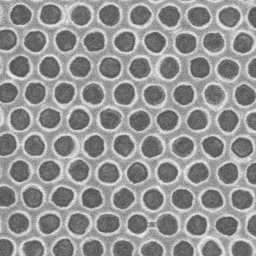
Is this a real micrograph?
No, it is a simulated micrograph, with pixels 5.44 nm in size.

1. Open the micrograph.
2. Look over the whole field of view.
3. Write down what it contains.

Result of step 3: a regular array of holes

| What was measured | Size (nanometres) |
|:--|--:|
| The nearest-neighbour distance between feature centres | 158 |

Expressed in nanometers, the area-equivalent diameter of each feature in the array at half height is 118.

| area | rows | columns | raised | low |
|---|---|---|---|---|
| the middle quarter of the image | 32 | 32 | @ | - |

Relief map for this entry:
@------@@-----@@------@@-----@@@
@------@@-----@@------@------@@@
@@----@@@-----@@@----@@@----@@@@
@@@@@@@@@@@-@@@@@@--@@@@@--@@@@@
@@@@@@@@@@@@@@@@@@@@@@@@@@@@@@@@
--@@@----@@@@----@@@@---@@@@----
---@@-----@@@-----@@-----@@@----
---@------@@------@@-----@@-----
--@@@-----@@@-----@@-----@@-----
-@@@@----@@@@----@@@@----@@@----
@@@@@@@-@@@@@@@@@@@@@@--@@@@@@@@
@@@--@@@@@----@@@@@@@@@@@@@@@@@@
@@----@@@-----@@@----@@@----@@@-
@------@@-----@@------@------@@-
@-----@@@-----@@------@-----@@@-
@-----@@@----@@@@----@@@----@@@-
@@--@@@@@@@@@@@@@@--@@@@---@@@@@
@@@@@@@@@@@@@@@@@@@@@@@@@@@@@@@@
---@@@---@@@@----@@@----@@@@@--@
---@@-----@@-----@@@----@@@-----
---@@-----@@------@------@@-----
---@@-----@@------@------@@-----
--@@@@---@@@@----@@@----@@@@----
@@@@@@@-@@@@@@@@@@@@@-@@@@@@@@@@
@@---@@@@@--@@@@@@-@@@@@@-@@@@@@
@-----@@@----@@@@----@@@----@@@@
@-----@@------@@-----@@------@@-
@-----@@------@@-----@@------@--
@@----@@@-----@@-----@@-----@@@-
@@@--@@@@----@@@@--@@@@@@--@@@@@
@@@@@@@@@@@@@@@@@@@@@@@@@@@@@@@@
--@@@---@@@@@@--@@@@@---@@@@---@